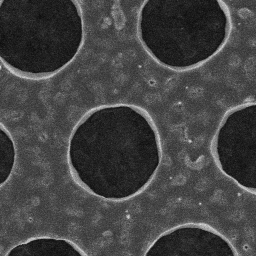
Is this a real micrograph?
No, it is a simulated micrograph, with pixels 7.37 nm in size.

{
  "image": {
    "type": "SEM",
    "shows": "holes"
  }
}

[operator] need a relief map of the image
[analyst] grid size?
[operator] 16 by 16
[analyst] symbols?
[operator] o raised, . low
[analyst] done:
.....oooo.....oo
.....oooo.....oo
.....oooo.....oo
.....ooooo...ooo
o..ooooooooooooo
oooooooooooooooo
oooooooooooooooo
ooooo....ooooo..
.ooo......ooo...
.ooo......ooo...
.ooo......oooo..
ooooo....oooooo.
oooooooooooooooo
oooooooooooooooo
oooooooooo...ooo
o....oooo......o